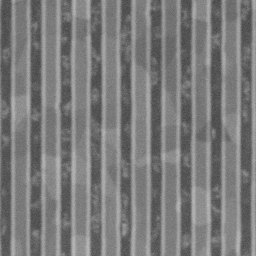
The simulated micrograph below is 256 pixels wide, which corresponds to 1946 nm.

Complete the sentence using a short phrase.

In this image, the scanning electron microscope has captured parallel lines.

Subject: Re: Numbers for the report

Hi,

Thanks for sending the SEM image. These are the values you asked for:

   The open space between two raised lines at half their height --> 116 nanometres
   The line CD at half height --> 116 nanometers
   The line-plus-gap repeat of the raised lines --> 228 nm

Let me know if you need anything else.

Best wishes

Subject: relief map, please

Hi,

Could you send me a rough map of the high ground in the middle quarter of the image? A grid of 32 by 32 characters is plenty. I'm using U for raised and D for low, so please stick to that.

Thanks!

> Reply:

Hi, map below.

DDUUUUDDDDUUUUDDDUUUUDDDDUUUUDDD
DDUUUUDDDDUUUUDDDUUUUDDDDUUUUDDD
DDUUUUDDDDUUUUDDDUUUUDDDDUUUUDDD
DDUUUUDDDDUUUUDDDUUUUDDDDUUUUDDD
DDUUUUDDDDUUUUDDDUUUUDDDDUUUUDDD
DDUUUUDDDDUUUUDDDUUUUDDDDUUUUDDD
DDUUUUDDDDUUUUDDDUUUUDDDDUUUUDDD
DDUUUUDDDDUUUUDDDUUUUDDDDUUUUDDD
DDDUUUDDDDUUUUDDDUUUUDDDDUUUUDDD
DDDUUUDDDDUUUUDDDUUUUDDDDUUUUDDD
DDUUUUDDDDUUUUDDDUUUUDDDDUUUUDDD
DDUUUUDDDDUUUUDDDUUUUDDDDUUUUDDD
DDUUUUDDDDUUUUDDDDUUUDDDDUUUUDDD
DDUUUUDDDDUUUUDDDUUUUDDDDUUUUDDD
DDDUUUDDDDUUUUDDDUUUUDDDDUUUUDDD
DDDUUUDDDDUUUUDDDUUUUDDDDUUUUDDD
DDDUUUDDDDUUUUDDDUUUUDDDDUUUDDDD
DDDUUUDDDDUUUUDDDUUUUDDDDUUUDDDD
DDDUUUDDDDUUUUDDDUUUUDDDDUUUDDDD
DDDUUUDDDDUUUUDDDUUUUDDDDUUUDDDD
DDDUUUDDDDUUUUDDDUUUUDDDDUUUDDDD
DDDUUUDDDDUUUUDDDUUUUDDDDUUUDDDD
DDDUUUDDDDUUUUDDDUUUUDDDDUUUDDDD
DDDUUUDDDDUUUUDDDUUUUDDDDUUUUDDD
DDDUUUDDDDUUUUDDDUUUUDDDDUUUUDDD
DDDUUUDDDDUUUUDDDUUUUDDDDUUUDDDD
DDDUUUDDDDUUUUDDDUUUUDDDDUUUDDDD
DDDUUUDDDDUUUUDDDUUUUDDDDUUUDDDD
DDUUUUDDDDUUUUDDDUUUUDDDDUUUUDDD
DDUUUUDDDDUUUUDDDUUUUDDDDUUUUDDD
DDUUUUDDDDUUUUDDDUUUUDDDDUUUDDDD
DDUUUUDDDDUUUUDDDUUUUDDDDUUUDDDD